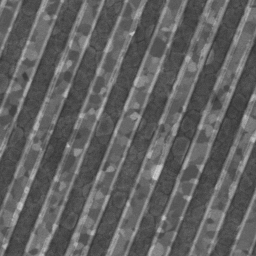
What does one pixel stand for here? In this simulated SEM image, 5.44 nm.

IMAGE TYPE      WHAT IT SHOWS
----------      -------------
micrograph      parallel lines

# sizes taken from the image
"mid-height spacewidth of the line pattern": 0.119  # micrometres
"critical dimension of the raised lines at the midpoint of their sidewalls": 92.2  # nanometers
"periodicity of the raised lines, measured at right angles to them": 208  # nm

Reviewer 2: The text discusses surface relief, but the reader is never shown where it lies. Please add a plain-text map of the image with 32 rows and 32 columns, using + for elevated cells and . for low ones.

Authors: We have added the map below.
++...+++...++...++...++...++...+
++...++...++...+++...++...++...+
++...++...++...++...++...++...++
+...++...++....++...++...++...++
+...++...++...+++..++...+++...++
....++...++...++...++...++...++.
...++...++...+++...++...++...++.
...++...++...++...++...++...+++.
..++...++....++...++...++...++..
..++...++...++...++...+++...++..
.+++..+++...++...++...++...++...
.++...++...++....++...++...++...
.++...++...++...++...++...+++...
++...++...+++...++...++...++...+
++...++...++...++...+++...++...+
++...++...++...++...++...++...++
+...++...++....++...++...++...++
+...++...++...++...++...+++...++
...+++..+++...++...++...++...++.
...++...++...++...+++...++...++.
...++...++...++...++...++...++..
..++...+++...++...++...++...++..
..++...++...++...++...+++..+++..
.+++..+++...++...++...++...++...
.++...++...++...+++...++...++...
.++...++...++...++...++...++...+
++...++....++...++...++...++...+
++...++...++...++...+++...++...+
++..+++...++...++...++...++...++
+...++...++...+++...++...++...++
+...++...++...++...++...++...+++
...+++...++...++...++...++...++.